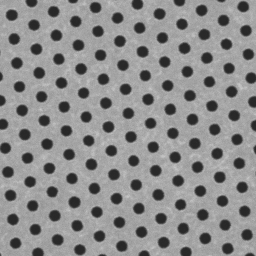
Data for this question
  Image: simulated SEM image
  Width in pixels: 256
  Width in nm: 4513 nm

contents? a regular array of holes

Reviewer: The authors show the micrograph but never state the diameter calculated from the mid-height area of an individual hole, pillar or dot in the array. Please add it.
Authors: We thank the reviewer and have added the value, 211 nanometers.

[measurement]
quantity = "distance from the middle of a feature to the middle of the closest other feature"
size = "419 nm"